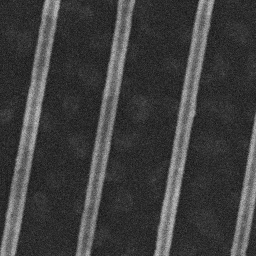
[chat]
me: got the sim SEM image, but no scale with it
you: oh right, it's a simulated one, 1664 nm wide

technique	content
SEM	one or a few lines or trenches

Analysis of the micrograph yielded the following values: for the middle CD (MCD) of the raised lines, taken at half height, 71.3 nm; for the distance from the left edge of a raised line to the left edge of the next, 0.492 micrometres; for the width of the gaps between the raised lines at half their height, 424 nanometers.